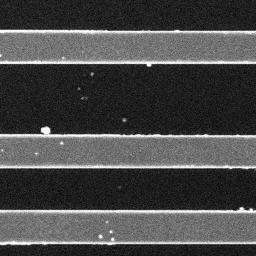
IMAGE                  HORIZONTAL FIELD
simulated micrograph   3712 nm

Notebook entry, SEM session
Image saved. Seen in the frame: lines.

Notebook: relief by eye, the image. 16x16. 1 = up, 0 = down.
0000000000000000
0000000000000000
1111111111111111
1111111111111111
0000000000000000
0000000000000000
0000000000000000
0000000000000000
1111111111111111
1111111111111111
0000000000000000
0000000000000000
0000000000000000
1111111111111111
1111111111111111
0000000000000000